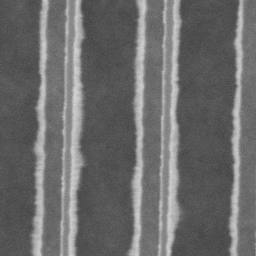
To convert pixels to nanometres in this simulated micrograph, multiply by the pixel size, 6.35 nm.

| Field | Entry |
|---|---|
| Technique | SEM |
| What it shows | lines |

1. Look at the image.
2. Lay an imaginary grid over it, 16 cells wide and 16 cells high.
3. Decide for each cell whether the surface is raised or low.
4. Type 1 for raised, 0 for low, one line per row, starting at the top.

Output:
0001100001100001
0001100001100001
0001100001100001
0001100001100001
0001100001100001
0001100001100001
0001100001100001
0001100001100001
0001100001100001
0001100001100001
0001100001100001
0001100001100001
0001100001100001
0001000001100001
0011000001100001
0011000001100001